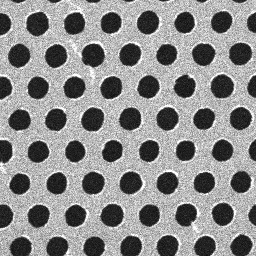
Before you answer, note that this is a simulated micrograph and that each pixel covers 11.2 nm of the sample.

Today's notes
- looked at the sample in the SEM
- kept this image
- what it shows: a regular array of holes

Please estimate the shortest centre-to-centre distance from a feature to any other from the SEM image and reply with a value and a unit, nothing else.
0.408 microns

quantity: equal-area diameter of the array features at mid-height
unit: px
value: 22.4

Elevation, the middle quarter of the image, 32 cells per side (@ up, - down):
@@@@@@@--@@@@@@---@@@@@@@-@@@@@@
@@@@@@@@@@@@@@@@@@@@@@@@@@@@@@@@
@@@@@@@@@@@@@@@@@@@@@@@@@@@@@@-@
@---@@@@@@@---@@@@@----@@@@@---@
-----@@@@-----@@@@@-----@@@@----
-----@@@@------@@@------@@@-----
-----@@@@-----@@@@------@@@-----
-----@@@@-----@@@@@----@@@@@----
@---@@@@@@--@@@@@@@@--@@@@@@@@-@
@@@@@@@@@@@@@@@@@@@@@@@@@@@@@@@@
@@@@@@@@@@@@@@@@@@@@@@@@@@@@@@@@
@@@@@----@@@@@@---@@@@@@----@@@@
@@@@@-----@@@@-----@@@@-----@@@@
-@@@------@@@@-----@@@@------@@@
-@@@------@@@@-----@@@@-----@@@@
@@@@@-----@@@@-----@@@@@----@@@@
@@@@@@---@@@@@@--@@@@@@@@--@@@@@
@@@@@@@@@@@@@@@@@@@@@@@@@@@@@@@@
@@@@@@@@@@@@@@@@@@@@@@@@@@@@@@@@
@---@@@@@@@---@@@@@@---@@@@@@---
@----@@@@@-----@@@@-----@@@@----
------@@@@-----@@@@-----@@@@----
-----@@@@------@@@@-----@@@@----
@----@@@@@----@@@@@----@@@@@@---
@@--@@@@@@@-@@@@@@@@@-@@@@@@@@@@
@@@@@@@@@@@@@@@@@@@@@@@@@@@@@@@@
@@@@@@@@@@@@@@@@@@@@@@@@@@@@@@@@
@@@@@@---@@@@@@----@@@@@----@@@@
-@@@@-----@@@@-----@@@@-----@@@@
-@@@------@@@@------@@@------@@@
-@@@------@@@@------@@@------@@@
@@@@@----@@@@@-----@@@@-----@@@@